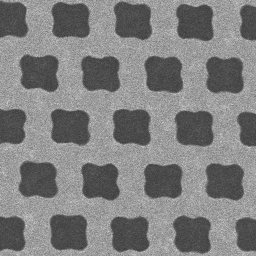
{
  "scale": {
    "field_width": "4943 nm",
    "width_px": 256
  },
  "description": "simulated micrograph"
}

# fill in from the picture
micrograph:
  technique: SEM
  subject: a regular array of holes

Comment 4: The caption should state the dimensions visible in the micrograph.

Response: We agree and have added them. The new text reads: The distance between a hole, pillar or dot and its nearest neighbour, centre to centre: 1180 nanometers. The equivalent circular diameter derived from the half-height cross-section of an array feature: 756 nanometers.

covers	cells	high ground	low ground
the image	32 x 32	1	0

00011110011111100011111111111111
00011100000111000001110000011100
00011110000111000001110000111100
00001110000111000001110000011100
00011110000111100001110000011100
11111111111111111111111111111111
11111111111111111111111111111111
11100001110000011100001111000011
11100001110000011100000111000011
11100001110000011100000111000011
11100001110000011100000111000011
11111111111111111111101111000011
11111111111111111111111111111111
11111111111111111111111111111111
00011100000111000001110000111100
00011110000111000001110000011100
00011100000111000001110000011100
00011110000111100001110000011100
11111111111111111111111111111111
11111111111111111111111111111111
11100011111111111111111111111111
11000001110000011100000111000011
11100001110000011100000111000011
11000001110000011100000111000011
11101001111000011110001111000011
11111111111111111111111111111111
11111111111111111111111111111111
00011100000111000011110000111100
00011100000111000001110000111000
00011100000111000011110000111100
00011100000111000001110000111100
11111111111111111111111100111111